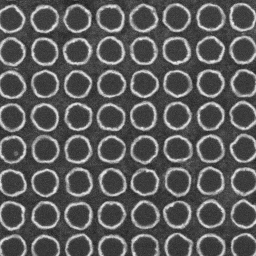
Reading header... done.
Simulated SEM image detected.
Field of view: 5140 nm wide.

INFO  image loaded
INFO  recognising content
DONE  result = a regular array of raised bodies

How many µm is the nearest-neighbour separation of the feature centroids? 0.652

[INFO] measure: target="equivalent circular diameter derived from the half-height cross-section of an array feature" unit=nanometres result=529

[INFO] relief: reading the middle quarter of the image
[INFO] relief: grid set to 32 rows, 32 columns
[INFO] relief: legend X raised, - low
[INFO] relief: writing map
--------------------------------
--------------------------------
-XXXX-----XXXX----XXXX----XXXX--
-XXXXX---XXXXXX--XXXXXX--XXXXXX-
XXXXXXX--XXXXXX--XXXXXX--XXXXXXX
XXXXXXX--XXXXXX--XXXXXXX-XXXXXXX
-XXXXX---XXXXXX--XXXXXX--XXXXXX-
-XXXXX---XXXXX----XXXX-----XXX--
--------------------------------
--------------------------------
--XXX-----XXX-----XXXX----XXXX--
-XXXXXX--XXXXX---XXXXXX--XXXXXX-
-XXXXXX--XXXXXX--XXXXXX--XXXXXXX
-XXXXXX-XXXXXXX--XXXXXX--XXXXXXX
-XXXXXX--XXXXXX--XXXXX---XXXXXX-
-XXXXX---XXXXX----XXXX----XXXX--
---X----------------------------
--------------------------------
--XXX------XX------XXX----XXXX--
-XXXXX---XXXXXX---XXXXX--XXXXXX-
XXXXXXX--XXXXXX--XXXXXX--XXXXXXX
XXXXXXX--XXXXXX--XXXXXX--XXXXXXX
-XXXXXX--XXXXXX--XXXXXX--XXXXXXX
-XXXXX---XXXXX---XXXXX----XXXXX-
--XXX--------------XX-----------
--------------------------------
---XX------XX------XXX-----XXX--
-XXXXX---XXXXX----XXXXX---XXXXX-
-XXXXXX--XXXXXX--XXXXXX--XXXXXX-
-XXXXXX--XXXXXX--XXXXXX---XXXXXX
-XXXXXX--XXXXXX--XXXXXX---XXXXX-
-XXXXXX---XXXXX---XXXXX---XXXXX-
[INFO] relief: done